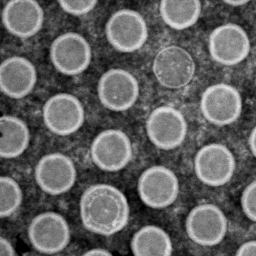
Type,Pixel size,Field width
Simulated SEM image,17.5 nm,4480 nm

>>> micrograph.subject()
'a regular array of raised bodies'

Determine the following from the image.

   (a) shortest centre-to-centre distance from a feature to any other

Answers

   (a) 1040 nm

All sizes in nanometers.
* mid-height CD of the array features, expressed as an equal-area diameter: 666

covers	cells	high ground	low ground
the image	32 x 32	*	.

.***....****........*****.......
.****....**....*....*****.......
.****.........****...***........
.****.........****..........**..
........**....****.........****.
.......****...****........*****.
.......****................****.
.**....****................***..
****...***......................
****.........***................
****.........****...............
.**..........****.........***...
......***....****........*****..
......****....**.........*****..
......****.........***....****..
***...****.........****.........
***....**.....*....****.........
***.........****...****........*
***.........****..........**....
......**....****.........****...
.....****...****.........****...
.....****.........***....****...
*....****.........****...***....
**...****...**...*****.........*
**.........****...****.........*
**........******..***..........*
*.........******........***....*
....****..******........****....
....****...****...*.....****....
....*****........****...****....
*...****.........****..........*
**.........**....****.........**